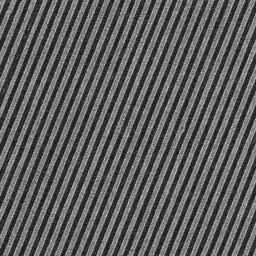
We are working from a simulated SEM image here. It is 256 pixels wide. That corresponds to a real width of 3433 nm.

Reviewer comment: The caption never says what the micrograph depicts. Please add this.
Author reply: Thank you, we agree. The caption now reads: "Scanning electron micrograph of parallel lines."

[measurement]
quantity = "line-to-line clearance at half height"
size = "71.6 nanometres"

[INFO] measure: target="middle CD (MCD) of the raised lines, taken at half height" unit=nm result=60.7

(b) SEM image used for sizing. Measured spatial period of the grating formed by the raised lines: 0.13 µm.